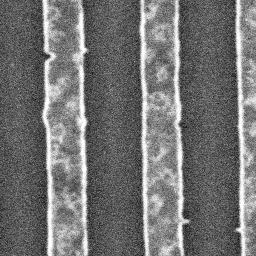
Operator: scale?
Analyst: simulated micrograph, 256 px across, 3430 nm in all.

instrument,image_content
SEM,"one or a few lines or trenches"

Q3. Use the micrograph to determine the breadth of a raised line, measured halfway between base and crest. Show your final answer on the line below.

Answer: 472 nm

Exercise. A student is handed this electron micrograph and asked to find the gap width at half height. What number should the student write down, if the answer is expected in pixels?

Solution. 60.9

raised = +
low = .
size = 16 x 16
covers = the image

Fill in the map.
...++....++....+
...++....++....+
...++....++....+
...++....++....+
...++....++....+
...++....++....+
...++....++....+
...++....++....+
...++....++....+
...++....++....+
...++....++....+
...++....++....+
...++....++....+
...++....++....+
...++....++....+
...++....++....+